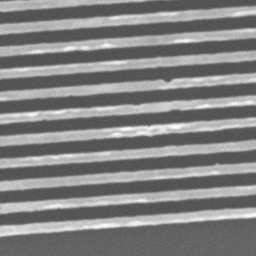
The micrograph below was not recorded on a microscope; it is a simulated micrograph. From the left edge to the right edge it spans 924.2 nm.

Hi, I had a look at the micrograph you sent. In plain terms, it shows parallel lines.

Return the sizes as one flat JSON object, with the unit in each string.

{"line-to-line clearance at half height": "47.7 nm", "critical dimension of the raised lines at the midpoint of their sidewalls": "31.5 nanometers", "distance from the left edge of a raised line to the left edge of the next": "80.6 nanometers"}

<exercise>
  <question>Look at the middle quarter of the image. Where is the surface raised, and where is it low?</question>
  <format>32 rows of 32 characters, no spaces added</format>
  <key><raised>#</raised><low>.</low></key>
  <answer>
########################........
###########.....................
................................
................................
...................######..#####
....##.#########################
#####################...........
#######.........................
................................
...........................#####
..............##################
###########################..#..
##############.#................
#...............................
................................
.......................#########
.........#######################
#######################.........
#########.......................
................................
.............................###
...................#############
..#############################.
################.##.............
##..#...........................
................................
.........................#######
.........##.####################
#########################.......
############....................
................................
................................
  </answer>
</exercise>